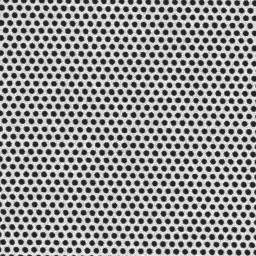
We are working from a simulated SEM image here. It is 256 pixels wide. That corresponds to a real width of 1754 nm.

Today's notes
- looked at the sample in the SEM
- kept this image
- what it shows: a regular array of holes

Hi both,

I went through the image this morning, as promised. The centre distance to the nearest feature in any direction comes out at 58.5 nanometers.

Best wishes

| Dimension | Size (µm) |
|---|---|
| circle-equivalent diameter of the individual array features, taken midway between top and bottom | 0.0387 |